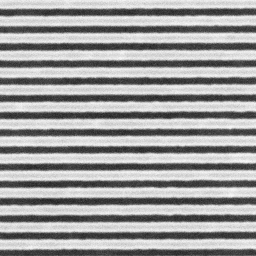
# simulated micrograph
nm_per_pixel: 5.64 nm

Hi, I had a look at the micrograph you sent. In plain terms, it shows parallel lines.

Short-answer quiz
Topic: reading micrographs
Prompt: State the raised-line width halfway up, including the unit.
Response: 52.2 nm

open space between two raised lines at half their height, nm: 47.3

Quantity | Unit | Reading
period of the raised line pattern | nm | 97.1